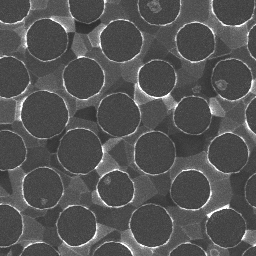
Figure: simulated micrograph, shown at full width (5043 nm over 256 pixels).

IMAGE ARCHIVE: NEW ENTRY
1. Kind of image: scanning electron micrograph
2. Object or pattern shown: a regular array of holes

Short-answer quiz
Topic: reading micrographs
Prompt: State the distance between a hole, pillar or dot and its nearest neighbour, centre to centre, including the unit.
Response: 1.01 um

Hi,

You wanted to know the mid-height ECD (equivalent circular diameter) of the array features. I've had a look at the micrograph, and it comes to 0.791 microns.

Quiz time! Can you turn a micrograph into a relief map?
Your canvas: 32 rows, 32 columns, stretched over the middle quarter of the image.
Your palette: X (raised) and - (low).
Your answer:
X--------XXXXXXXXXXX-------XXXXX
----------XXXXXXXXX---------XXXX
----------XXXXXXXXX---------XXXX
----------XXXXXXXX----------XXXX
----------XXXXXXXXX---------XXXX
----------XXXXXXXXX---------XXXX
X--------XXXX-XXXXXX-------XXXXX
XX------XXXX---XXXXXX-----XXXXXX
XXX---XXXX-------XXXXXXXXXXXXX--
XXXXXXXXX---------XXXXXXXXXXX---
XXXXXXXXX---------XXXXXXXXXX----
-XXXXXXX-----------XXXXXXX-X----
-XXXXXXX-----------XXXXXXX------
-XXXXXXX-----------XXXXXXX------
-XXXXXXX-----------XXXXXXX------
XXXXXXXXX-----------XXXXXX-X----
XX----XXXX-----------XXXXX------
--------XXX--------------X-XXXXX
---------XXX--X-----------XXXXXX
---------XX---XX-----------XXXXX
---------X--XXXXXX----------XXXX
-----------XXXXXXX----------XXXX
----------XXXXXXXX----------XXXX
----------XXXXXXXX----------XXXX
---------XXXXXXXXX----------XXXX
--------XXXXXXXXX----------XXXXX
X------XXXXXXXXXXX--------XXXXXX
XXXXXXXXXX------XXX-X---XXXXX---
X-XXXXXXX-------XXXXX-XXXXXX----
XXXXXXXXX--------XXXXXXXXXX-----
-XXXXXXX---------XXXXXXXXXX-----
XXXXXXXX----------XXXXXXXXX-----